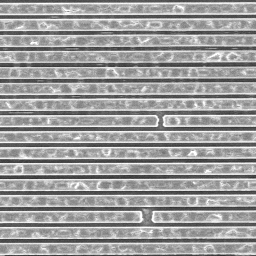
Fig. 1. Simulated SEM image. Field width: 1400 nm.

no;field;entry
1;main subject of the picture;parallel lines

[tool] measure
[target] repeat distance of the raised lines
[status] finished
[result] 87.6 nm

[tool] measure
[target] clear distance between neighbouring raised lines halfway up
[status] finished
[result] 25.3 nanometers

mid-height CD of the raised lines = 61.5 nm